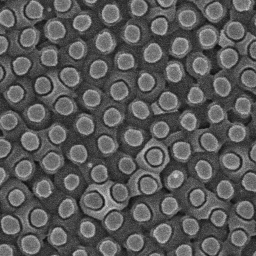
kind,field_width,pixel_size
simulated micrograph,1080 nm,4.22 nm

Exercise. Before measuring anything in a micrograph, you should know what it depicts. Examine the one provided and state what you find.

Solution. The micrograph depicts a regular array of raised bodies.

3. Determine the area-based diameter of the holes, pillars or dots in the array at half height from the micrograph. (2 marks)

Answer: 70.5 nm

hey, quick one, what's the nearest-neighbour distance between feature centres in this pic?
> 74.2 nm